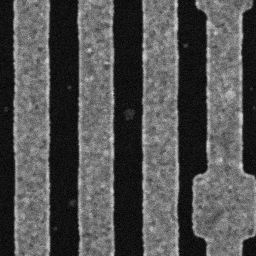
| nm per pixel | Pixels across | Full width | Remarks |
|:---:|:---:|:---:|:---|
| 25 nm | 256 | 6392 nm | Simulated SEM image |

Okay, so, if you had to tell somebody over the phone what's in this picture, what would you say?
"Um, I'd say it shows wiring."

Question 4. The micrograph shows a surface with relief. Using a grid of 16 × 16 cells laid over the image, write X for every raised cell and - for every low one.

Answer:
-XX--XX--XX--XX-
-XX--XX--XX--XX-
-XX--XX--XX--XX-
-XX--XX--XX--XX-
-XX--XX--XX--XX-
-XX--XX--XX--XX-
-XX--XX--XX--XX-
-XX--XX--XX--XX-
-XX--XX--XX--XX-
-XX--XX--XX--XX-
-XX--XX--XX--XX-
-XX--XX--XX-XXXX
-XX--XX--XX-XXXX
-XX--XX--XX-XXXX
-XX--XX--XX-XXXX
-XX--XX--XX--XX-